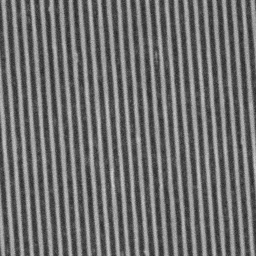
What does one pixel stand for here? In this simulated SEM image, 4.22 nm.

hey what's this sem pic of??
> parallel lines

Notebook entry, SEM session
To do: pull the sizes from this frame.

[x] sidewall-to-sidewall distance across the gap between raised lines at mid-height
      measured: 23.7 nm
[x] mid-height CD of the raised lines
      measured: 15.8 nanometres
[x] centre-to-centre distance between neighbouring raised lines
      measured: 40.3 nm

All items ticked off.